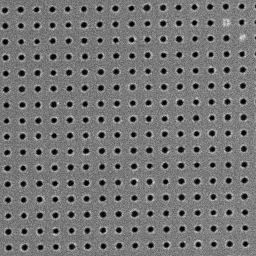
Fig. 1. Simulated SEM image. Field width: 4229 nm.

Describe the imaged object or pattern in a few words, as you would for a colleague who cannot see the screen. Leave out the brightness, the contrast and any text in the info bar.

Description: a regular array of holes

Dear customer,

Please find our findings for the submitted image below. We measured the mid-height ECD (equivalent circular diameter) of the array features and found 106 nm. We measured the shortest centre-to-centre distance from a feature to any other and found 258 nm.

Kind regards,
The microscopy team